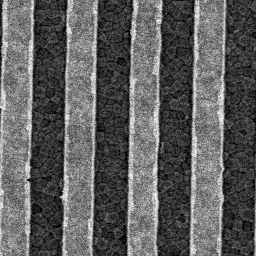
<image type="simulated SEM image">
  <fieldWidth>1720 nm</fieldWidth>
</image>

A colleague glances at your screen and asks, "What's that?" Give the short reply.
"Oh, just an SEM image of one or a few lines or trenches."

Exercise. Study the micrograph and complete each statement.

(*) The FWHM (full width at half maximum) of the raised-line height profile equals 28.5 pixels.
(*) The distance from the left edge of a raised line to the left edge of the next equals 64.1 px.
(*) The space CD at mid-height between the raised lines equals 239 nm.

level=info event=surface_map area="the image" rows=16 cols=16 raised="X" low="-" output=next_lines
XX--XX--XX--XX--
XX--XX--XX--XX--
XX--XX--XX--XX--
XX--XX--XX--XX--
XX--XX--XX--XX--
XX--XX--XX--XX--
XX--XX--XX--XX--
XX--XX--XX--XX--
XX--XX--XX--XX--
XX--XX--XX--XX--
XX--XX--XX--XX--
XX--XX--XX--XX--
XX--XX--XX--XX--
XX--XX--XX--XX--
XX--XX--XX--XX--
XX--XX--XX--XX--